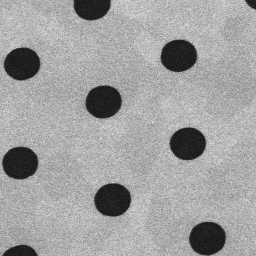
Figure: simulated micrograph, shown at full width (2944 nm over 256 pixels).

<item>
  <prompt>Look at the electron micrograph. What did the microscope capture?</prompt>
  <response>holes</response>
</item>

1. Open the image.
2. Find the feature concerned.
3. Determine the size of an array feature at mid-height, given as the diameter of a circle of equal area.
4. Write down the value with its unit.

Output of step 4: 398 nm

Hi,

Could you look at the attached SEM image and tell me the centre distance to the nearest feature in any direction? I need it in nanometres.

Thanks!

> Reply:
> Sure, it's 1030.